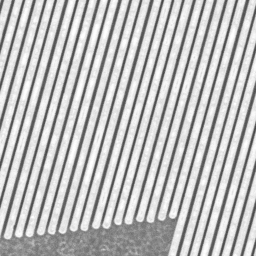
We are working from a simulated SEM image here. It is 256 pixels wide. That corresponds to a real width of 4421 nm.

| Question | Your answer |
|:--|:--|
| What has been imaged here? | parallel lines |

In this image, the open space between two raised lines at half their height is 52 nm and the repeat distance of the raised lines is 178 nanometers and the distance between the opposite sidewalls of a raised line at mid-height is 121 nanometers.